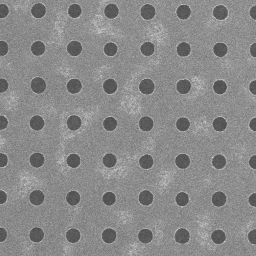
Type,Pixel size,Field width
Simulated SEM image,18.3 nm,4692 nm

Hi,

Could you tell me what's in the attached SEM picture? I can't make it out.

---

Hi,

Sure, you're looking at a regular array of holes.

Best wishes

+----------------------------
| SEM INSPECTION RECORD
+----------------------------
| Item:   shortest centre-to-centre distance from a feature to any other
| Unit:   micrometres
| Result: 0.665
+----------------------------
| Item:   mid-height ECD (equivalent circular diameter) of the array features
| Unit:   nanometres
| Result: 273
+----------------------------